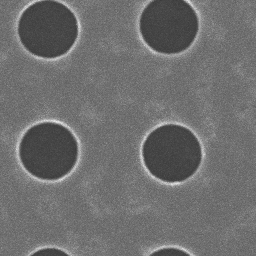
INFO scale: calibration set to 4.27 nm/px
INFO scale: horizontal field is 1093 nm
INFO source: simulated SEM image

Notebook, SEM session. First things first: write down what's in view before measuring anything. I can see holes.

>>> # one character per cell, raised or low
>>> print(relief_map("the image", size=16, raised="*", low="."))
**..*****...****
*....****...****
*....****...****
**..************
****************
****************
****************
****************
*....****...****
*....****....***
**..*****...****
****************
****************
****************
****************
****************